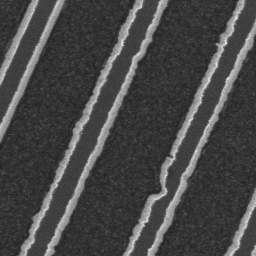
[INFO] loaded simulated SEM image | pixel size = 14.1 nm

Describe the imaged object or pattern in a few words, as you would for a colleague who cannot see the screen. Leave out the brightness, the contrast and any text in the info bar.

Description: one or a few lines or trenches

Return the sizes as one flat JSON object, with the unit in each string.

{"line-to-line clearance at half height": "980 nanometers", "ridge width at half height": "349 nanometers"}